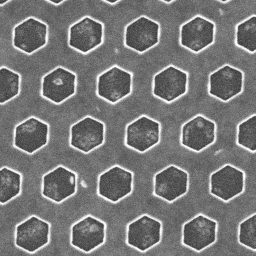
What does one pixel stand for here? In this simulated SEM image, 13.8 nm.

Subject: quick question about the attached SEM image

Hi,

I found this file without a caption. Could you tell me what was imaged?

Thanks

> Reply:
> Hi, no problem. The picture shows a regular array of holes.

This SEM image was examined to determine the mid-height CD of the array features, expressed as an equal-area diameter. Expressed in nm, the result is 458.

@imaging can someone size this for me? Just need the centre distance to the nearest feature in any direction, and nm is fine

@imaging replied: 763